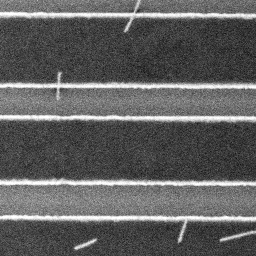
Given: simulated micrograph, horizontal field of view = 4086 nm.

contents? lines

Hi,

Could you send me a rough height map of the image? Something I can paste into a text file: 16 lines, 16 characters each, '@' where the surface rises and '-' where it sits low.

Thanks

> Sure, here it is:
----------------
@@@@@@@@@@@@@@@@
@@@@@@@@@@@@@@@@
@@@@@@@@@@@@@@@@
@@@@@@@@@@@@@@@@
----------------
----------------
@@@@@@@@@@@@@@@@
@@@@@@@@@@@@@@@@
@@@@@@@@@@@@@@@@
@@@@@@@@@@@@@@@@
@@@@@@@@@@@@@@@@
----------------
----------------
@@@@@@@@@@@@@@@@
@@@@@@@@@@@@@@@@